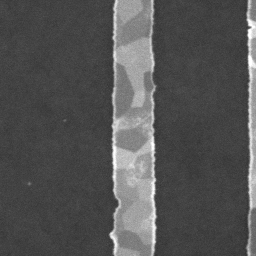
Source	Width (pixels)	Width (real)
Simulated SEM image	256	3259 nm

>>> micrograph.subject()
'one or a few lines or trenches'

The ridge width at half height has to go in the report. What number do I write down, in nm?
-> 494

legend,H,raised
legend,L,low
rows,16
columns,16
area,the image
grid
LLLLLLLHHHLLLLLL
LLLLLLLHHLLLLLLL
LLLLLLLHHLLLLLLL
LLLLLLLHHHLLLLLL
LLLLLLLHHHLLLLLL
LLLLLLLHHHLLLLLL
LLLLLLLHHHLLLLLL
LLLLLLLHHHLLLLLL
LLLLLLLHHHLLLLLL
LLLLLLLHHHLLLLLL
LLLLLLLHHHLLLLLL
LLLLLLLHHHLLLLLL
LLLLLLLHHHLLLLLL
LLLLLLLHHHLLLLLL
LLLLLLLHHHLLLLLL
LLLLLLLHHHLLLLLL